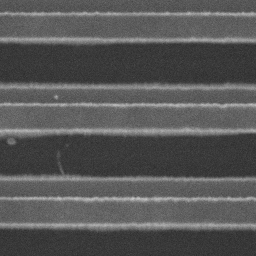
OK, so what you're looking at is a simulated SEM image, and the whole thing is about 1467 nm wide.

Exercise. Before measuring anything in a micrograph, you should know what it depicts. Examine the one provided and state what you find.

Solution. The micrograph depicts lines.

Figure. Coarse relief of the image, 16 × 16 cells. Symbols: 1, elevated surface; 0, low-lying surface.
1111111111111111
1111111111111111
0000001111111111
0000000000000000
0000000000000000
1111111111111111
1111111111111111
1111111111111111
0000000000000000
0000000000000000
0000000000000000
1111111111111111
1111111111111111
1111111111111111
0000000000000000
0000000000000000